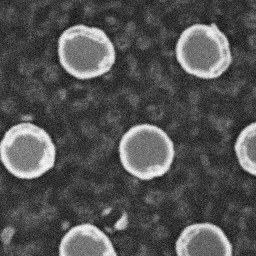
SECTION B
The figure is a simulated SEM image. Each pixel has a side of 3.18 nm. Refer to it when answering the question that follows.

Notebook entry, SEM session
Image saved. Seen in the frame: raised bodies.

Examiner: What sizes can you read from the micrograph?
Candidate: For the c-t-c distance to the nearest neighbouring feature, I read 0.366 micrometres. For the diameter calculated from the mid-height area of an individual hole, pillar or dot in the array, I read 0.163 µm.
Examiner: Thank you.